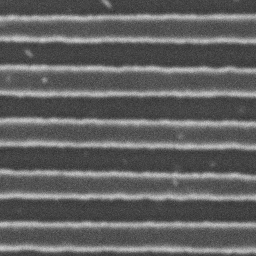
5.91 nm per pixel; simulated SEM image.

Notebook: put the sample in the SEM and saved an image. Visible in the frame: lines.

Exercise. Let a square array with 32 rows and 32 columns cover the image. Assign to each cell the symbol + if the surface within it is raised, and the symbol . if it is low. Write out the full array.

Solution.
................................
................................
++++++++++++++++++++++++++++++++
++++++++++++++++++++++++++++++++
++++++++++++++++++++++++++++++++
................................
................................
................................
++++++++++++++.+++++.....+..+...
++++++++++++++++++++++++++++++++
++++++++++++++++++++++++++++++++
++++++++++++++++++++++++++++++++
................................
................................
................................
++++++++++++++++++++++++++++++++
++++++++++++++++++++++++++++++++
++++++++++++++++++++++++++++++++
................................
................................
................................
++..+...........................
++++++++++++++++++++++++++++++++
++++++++++++++++++++++++++++++++
++++++++++++++++++++++++++++++++
................................
................................
................................
++++++++++++++++++++++++++++++++
++++++++++++++++++++++++++++++++
++++++++++++++++++++++++++++++++
............................+...